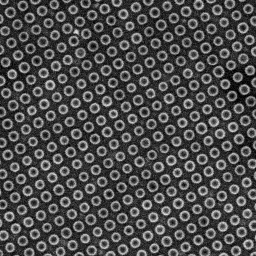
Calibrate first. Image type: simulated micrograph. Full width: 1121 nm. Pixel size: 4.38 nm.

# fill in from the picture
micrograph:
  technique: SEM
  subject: a regular array of raised bodies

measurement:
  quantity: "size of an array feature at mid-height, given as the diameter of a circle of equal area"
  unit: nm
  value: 41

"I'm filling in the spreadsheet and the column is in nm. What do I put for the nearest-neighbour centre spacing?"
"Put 59.5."